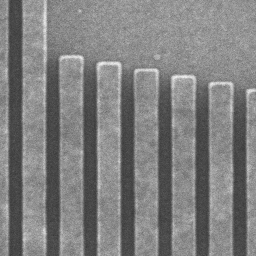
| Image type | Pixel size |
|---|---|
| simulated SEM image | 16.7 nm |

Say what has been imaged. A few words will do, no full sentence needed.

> groups of lines, slits or small figures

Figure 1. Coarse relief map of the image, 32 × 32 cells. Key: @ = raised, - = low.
@--@@@--------------------------
@--@@@--------------------------
@--@@@--------------------------
@--@@@--------------------------
@--@@@--------------------------
@--@@@--------------------------
@--@@@--------------------------
@--@@@--@@----------------------
@--@@@--@@--@@@-----------------
@--@@@--@@--@@@--@@@------------
@--@@@--@@--@@@--@@@--@@---@@---
@--@@@--@@--@@@--@@@--@@--@@@--@
@--@@@--@@--@@@--@@@--@@--@@@--@
@--@@@--@@--@@@--@@@--@@--@@@--@
@--@@@--@@--@@@--@@@--@@--@@@--@
@--@@@--@@--@@@--@@@--@@--@@@--@
@--@@@--@@--@@@--@@@--@@--@@@--@
@--@@@--@@--@@@--@@@--@@--@@@--@
@--@@@--@@--@@@--@@@--@@--@@@--@
@--@@@--@@--@@@--@@@--@@--@@@--@
@--@@@--@@--@@@--@@@--@@--@@@--@
@--@@@--@@--@@@--@@@--@@--@@@--@
@--@@@--@@--@@@--@@@--@@--@@@--@
@--@@@--@@--@@@--@@@--@@--@@@--@
@--@@@--@@--@@@--@@@--@@--@@@--@
@--@@@--@@--@@@--@@@--@@--@@@--@
@--@@@--@@--@@@--@@@--@@--@@@--@
@--@@@--@@--@@@--@@@--@@--@@@--@
@--@@@--@@--@@@--@@@--@@--@@@--@
@--@@@--@@--@@@--@@@--@@--@@@--@
@--@@@--@@--@@@--@@@--@@--@@@--@
@--@@@--@@--@@@--@@@--@@--@@@--@